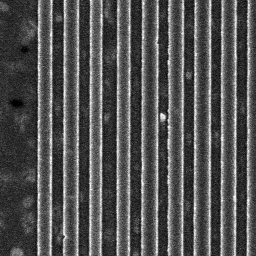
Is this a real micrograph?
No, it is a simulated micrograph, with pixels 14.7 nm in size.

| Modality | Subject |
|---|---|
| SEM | parallel lines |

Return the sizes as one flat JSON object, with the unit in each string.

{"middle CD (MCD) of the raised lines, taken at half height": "0.214 micrometres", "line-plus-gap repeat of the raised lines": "387 nm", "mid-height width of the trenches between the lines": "11.6 px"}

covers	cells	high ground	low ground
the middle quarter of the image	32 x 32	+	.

++++...++....+++....+++...++++..
++++...++....+++....+++...++++..
++++...++....+++....+++...++++..
++++...++....+++....+++...++++..
++++...++....+++....+++...++++..
++++...++....+++....+++...++++..
++++...++....+++....+++...++++..
++++...++....+++....+++...++++..
+++....++....+++....+++...++++..
+++....++....+++....+++...++++..
+++....++....+++...++++...++++..
+++....++....+++...++++...++++..
+++....++....+++...++++.+.++++..
+++....++.+..+++...++++.+.++++..
+++....++....+++...++++...++++..
+++....++....+++...++++...++++..
+++....++....+++...++++...++++..
+++....++....+++...++++...++++..
+++....++....+++...++++...++++..
+++....++....+++...++++...++++..
+++....++....+++...++++...++++..
+++....++....+++...++++...++++..
+++....++....+++...++++...++++..
+++....++....+++...++++...++++..
+++....++....+++...++++...++++..
+++....++....+++....+++...++++..
+++....++....+++...++++...++++..
+++....++....+++...++++...++++..
+++....++....+++...++++...++++..
+++....++....+++...++++...++++..
+++....++....+++...++++...++++..
+++....++....+++...++++...++++..